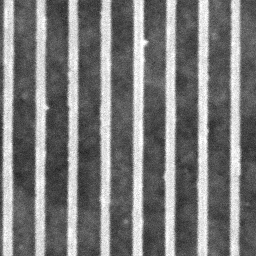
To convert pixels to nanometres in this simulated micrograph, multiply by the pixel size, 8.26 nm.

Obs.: parallel lines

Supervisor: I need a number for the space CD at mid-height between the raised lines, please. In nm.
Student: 205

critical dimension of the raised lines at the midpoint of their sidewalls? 0.0614 microns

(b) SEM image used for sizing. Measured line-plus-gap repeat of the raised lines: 268 nanometres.